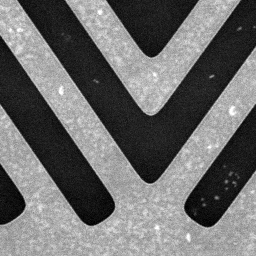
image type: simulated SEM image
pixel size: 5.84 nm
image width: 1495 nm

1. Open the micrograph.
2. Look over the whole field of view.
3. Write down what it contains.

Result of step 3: groups of lines, slits or small figures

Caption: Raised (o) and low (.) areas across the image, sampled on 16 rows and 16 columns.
o...ooo.....ooo.
oo...ooo...ooo..
ooo...oo...oo...
.oo....oo.oo....
..oo...ooooo...o
..ooo...ooo...oo
...ooo...o...ooo
o...oo.......oo.
o...ooo.....oo..
oo...ooo...ooo..
ooo...oo..ooo...
.oo...oooooo...o
.ooo...ooooo...o
.oooo..ooooo..oo
oooooooooooooooo
oooooooooooooooo